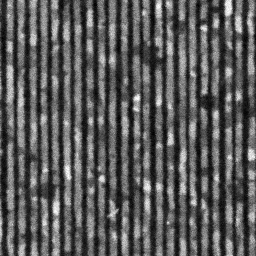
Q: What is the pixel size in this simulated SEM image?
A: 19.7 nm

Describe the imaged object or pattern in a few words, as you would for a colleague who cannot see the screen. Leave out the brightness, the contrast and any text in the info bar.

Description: parallel lines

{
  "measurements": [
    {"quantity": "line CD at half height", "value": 5.5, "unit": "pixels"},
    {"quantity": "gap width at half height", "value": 118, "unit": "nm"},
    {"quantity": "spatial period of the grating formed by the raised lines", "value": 0.226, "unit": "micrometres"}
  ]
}